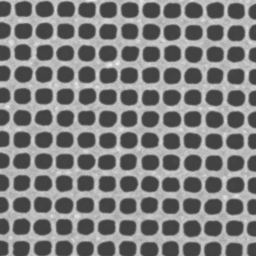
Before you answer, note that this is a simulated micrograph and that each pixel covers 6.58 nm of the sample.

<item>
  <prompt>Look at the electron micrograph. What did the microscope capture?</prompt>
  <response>a regular array of holes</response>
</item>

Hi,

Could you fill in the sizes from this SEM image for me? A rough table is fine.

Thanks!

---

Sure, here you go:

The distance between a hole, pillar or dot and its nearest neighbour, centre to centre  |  138 nanometers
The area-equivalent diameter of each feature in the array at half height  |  117 nm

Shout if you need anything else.